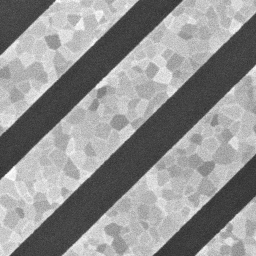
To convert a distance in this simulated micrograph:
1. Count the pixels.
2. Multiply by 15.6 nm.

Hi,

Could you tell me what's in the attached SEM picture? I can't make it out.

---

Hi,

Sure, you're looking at lines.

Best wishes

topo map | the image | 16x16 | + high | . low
...+++++...+++++
..+++++...+++++.
.+++++...+++++..
+++++...+++++...
++++...+++++....
+++...+++++....+
++...+++++....++
+...+++++....+++
...+++++....++++
..+++++...++++++
.+++++...++++++.
+++++...++++++..
++++...++++++...
+++...++++++...+
++...++++++...++
+...++++++...+++